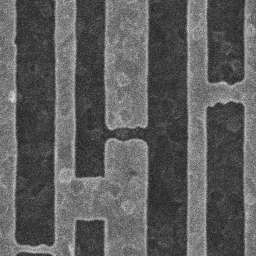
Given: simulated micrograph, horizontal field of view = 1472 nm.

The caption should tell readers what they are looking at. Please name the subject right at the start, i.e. one or a few lines or trenches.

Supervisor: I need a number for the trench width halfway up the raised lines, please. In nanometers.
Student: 228